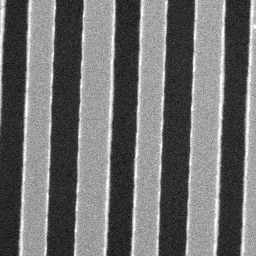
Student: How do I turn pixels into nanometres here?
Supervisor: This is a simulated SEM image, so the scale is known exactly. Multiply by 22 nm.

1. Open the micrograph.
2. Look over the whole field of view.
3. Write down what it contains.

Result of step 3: lines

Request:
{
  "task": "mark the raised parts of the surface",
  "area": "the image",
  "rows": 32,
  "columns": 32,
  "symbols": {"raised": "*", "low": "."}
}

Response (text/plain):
....***....***....***....***...*
....***...****....***...****...*
....***...****....***...****...*
....***...****....***...****...*
....***...****....***...****...*
....***...****....***...****...*
....***...****....***...****...*
....***...****....***...****...*
....***...****....***...****...*
...****...****....***...****...*
...***....****...***....****...*
...***....****...***....****...*
...***....****...***....****...*
...***....****...***....****...*
...***....****...***....****...*
...***....****...***....****...*
...***....****...***....***....*
...***....****...***....***....*
...***....****...***....***....*
...***....****...***....***....*
...***....****...***....***....*
...***....****...***....***....*
...***....***....***....***....*
...***....***....***....***....*
...***....***....***....***....*
...***....***....***....***....*
...***....***....***....***...**
...***....***....***...****...**
...***...****....***...****...**
...***...****....***...****...**
...***...****....***...****...**
...***...****....***...****...**